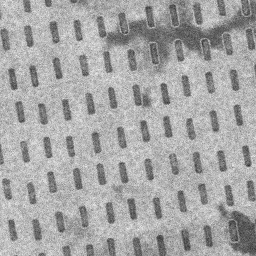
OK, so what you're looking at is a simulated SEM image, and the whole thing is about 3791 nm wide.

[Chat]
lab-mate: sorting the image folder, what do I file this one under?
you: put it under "a regular array of holes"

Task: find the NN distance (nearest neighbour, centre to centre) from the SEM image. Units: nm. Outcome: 347